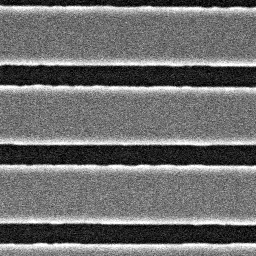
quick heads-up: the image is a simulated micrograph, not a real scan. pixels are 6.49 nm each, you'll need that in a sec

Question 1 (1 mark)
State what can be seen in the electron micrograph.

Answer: lines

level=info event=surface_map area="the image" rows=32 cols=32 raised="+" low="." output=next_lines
................................
++++++++++++++++++++++++++++++++
++++++++++++++++++++++++++++++++
++++++++++++++++++++++++++++++++
++++++++++++++++++++++++++++++++
++++++++++++++++++++++++++++++++
++++++++++++++++++++++++++++++++
++++++++++++++++++++++++++++++++
................................
................................
................................
++++++++++++++++++++++++++++++++
++++++++++++++++++++++++++++++++
++++++++++++++++++++++++++++++++
++++++++++++++++++++++++++++++++
++++++++++++++++++++++++++++++++
++++++++++++++++++++++++++++++++
++++++++++++++++++++++++++++++++
................................
................................
................................
++++++++++++++++++++++++++++++++
++++++++++++++++++++++++++++++++
++++++++++++++++++++++++++++++++
++++++++++++++++++++++++++++++++
++++++++++++++++++++++++++++++++
++++++++++++++++++++++++++++++++
++++++++++++++++++++++++++++++++
................................
................................
................................
++++++++++++++++++++++++++++++++